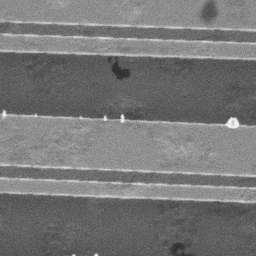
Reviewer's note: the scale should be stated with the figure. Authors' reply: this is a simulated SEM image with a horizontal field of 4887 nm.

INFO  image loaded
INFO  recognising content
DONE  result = lines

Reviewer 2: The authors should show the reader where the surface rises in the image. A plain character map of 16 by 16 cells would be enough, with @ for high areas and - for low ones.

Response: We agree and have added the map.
@@@@@@@@@@@@@@@@
@@@@@@@@@@@@@@@@
@@@@@@@@@@@@@@@@
-----------@@@@@
----------------
----------------
----------------
@@@@@@@@--------
@@@@@@@@@@@@@@@@
@@@@@@@@@@@@@@@@
@@@@@@@@@@@@@@@@
@@@@@@@@@@@@@@@@
-------------@@@
----------------
----------------
----------------